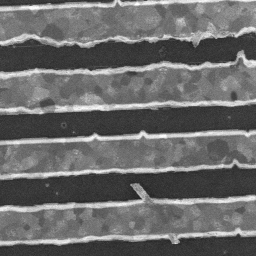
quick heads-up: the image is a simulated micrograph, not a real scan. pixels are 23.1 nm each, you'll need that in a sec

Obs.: one or a few lines or trenches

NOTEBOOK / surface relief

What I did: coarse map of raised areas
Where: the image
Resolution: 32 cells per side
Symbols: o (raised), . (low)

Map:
..............o.oooooooooooooooo
oooooooooooooooooooooooooooooooo
oooooooooooooooooooooooooooooooo
oooooooooooooooooooooooooooooooo
oooooooooooooooooooooooooo.o....
........................o.......
................................
..............................o.
...................ooooo.ooooooo
oooooooooooooooooooooooooooooooo
oooooooooooooooooooooooooooooooo
oooooooooooooooooooooooooooooooo
oooooooooooooooooooooooooooooooo
ooooooooooo.....................
................................
................................
................................
...........ooooooooooooooooooooo
oooooooooooooooooooooooooooooooo
oooooooooooooooooooooooooooooooo
ooooooooooooooooooooooooooooo.oo
ooooooooooo.....................
................................
.................o..............
..................o.............
................oooooooooooooooo
oooooooooooooooooooooooooooooooo
oooooooooooooooooooooooooooooooo
oooooooooooooooooooooooooooooooo
ooooooooooooooooooooooo.........
................................
................................